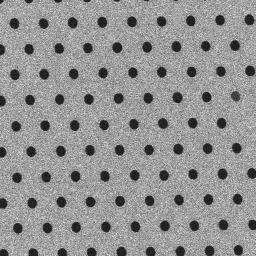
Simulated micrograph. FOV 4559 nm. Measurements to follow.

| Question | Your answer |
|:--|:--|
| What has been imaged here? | a regular array of holes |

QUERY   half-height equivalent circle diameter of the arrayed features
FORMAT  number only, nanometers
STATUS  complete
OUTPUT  180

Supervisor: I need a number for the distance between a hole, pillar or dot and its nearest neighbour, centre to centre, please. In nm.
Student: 517